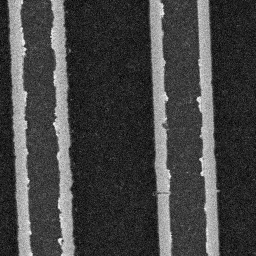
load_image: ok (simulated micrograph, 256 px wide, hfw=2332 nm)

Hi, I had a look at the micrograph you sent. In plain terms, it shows one or a few lines or trenches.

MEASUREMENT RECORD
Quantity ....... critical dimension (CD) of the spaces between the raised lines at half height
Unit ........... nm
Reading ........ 883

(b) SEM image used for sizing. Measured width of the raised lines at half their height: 422 nanometers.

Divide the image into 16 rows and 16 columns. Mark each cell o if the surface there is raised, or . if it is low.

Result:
.ooo......ooo...
.ooo......ooo...
.ooo......ooo...
.ooo......ooo...
.ooo......ooo...
.ooo......ooo...
.ooo......ooo...
.ooo......ooo...
.ooo......ooo...
.ooo......ooo...
.ooo......ooo...
.ooo......ooo...
.ooo......ooo...
.ooo......ooo...
..oo......ooo...
..oo......ooo...